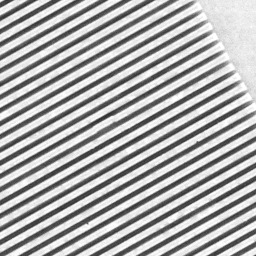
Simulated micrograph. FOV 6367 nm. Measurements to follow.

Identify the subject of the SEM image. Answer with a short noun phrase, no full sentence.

parallel lines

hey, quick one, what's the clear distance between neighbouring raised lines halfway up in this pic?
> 5.89 pixels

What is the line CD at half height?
146 nanometres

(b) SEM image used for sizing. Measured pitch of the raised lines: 286 nm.